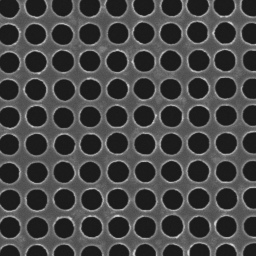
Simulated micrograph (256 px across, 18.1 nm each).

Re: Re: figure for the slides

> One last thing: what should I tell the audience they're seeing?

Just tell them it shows a regular array of holes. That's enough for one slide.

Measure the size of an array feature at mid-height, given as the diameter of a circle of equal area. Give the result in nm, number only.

381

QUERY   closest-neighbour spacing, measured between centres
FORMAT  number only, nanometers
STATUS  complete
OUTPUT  481